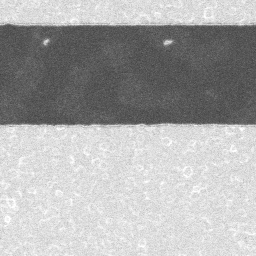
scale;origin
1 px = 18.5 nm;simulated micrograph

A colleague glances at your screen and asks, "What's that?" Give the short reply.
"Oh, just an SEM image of one or a few lines or trenches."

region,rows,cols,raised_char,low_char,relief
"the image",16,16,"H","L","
LLLLLLLLLLLLLLLL
HLLLLLLLLLHHLLLL
HHHHHHHHHHHHHHHH
HHHHHHHHHHHHHHHH
HHHHHHHHHHHHHHHH
HHHHHHHHHHHHHHHH
HHHHHHHHHHHHHHHH
HHHHHHHHHHHHHHHH
LLLLLLLLLLLLLLLL
LLLLLLLLLLLLLLLL
LLLLLLLLLLLLLLLL
LLLLLLLLLLLLLLLL
LLLLLLLLLLLLLLLL
LLLLLLLLLLLLLLLL
LLLLLLLLLLLLLLLL
LLLLLLLLLLLLLLLL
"